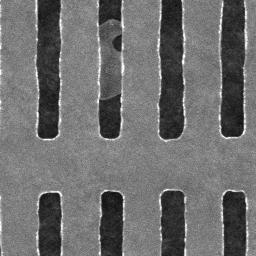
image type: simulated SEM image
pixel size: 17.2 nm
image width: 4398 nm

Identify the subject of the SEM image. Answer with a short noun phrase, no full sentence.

holes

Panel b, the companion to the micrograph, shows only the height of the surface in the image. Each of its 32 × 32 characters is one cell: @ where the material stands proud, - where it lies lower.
@@@@@---@@@@---@@@@@---@@@@@---@
@@@@@---@@@@---@@@@@---@@@@@---@
@@@@@--@@@@@---@@@@@---@@@@@---@
@@@@@--@@@@@---@@@@@---@@@@@---@
@@@@@---@@@@---@@@@@---@@@@@---@
@@@@@---@@@@---@@@@@---@@@@----@
@@@@@---@@@@---@@@@@---@@@@----@
@@@@---@@@@@@--@@@@@---@@@@@---@
@@@@@--@@@@@---@@@@@---@@@@@--@@
@@@@@--@@@@@---@@@@@---@@@@@--@@
@@@@@---@@@@---@@@@@---@@@@@---@
@@@@@---@@@@---@@@@@---@@@@@--@@
@@@@@--@@@@@---@@@@@---@@@@@--@@
@@@@@--@@@@@---@@@@@---@@@@@--@@
@@@@@--@@@@@---@@@@@---@@@@----@
@@@@@--@@@@@---@@@@@---@@@@@--@@
@@@@@--@@@@@@--@@@@@---@@@@@--@@
@@@@@@@@@@@@@@@@@@@@@@@@@@@@@@@@
@@@@@@@@@@@@@@@@@@@@@@@@@@@@@@@@
@@@@@@@@@@@@@@@@@@@@@@@@@@@@@@@@
@@@@@@@@@@@@@@@@@@@@@@@@@@@@@@@@
@@@@@@@@@@@@@@@@@@@@@@@@@@@@@@@@
@@@@@@@@@@@@@@@@@@@@@@@@@@@@@@@@
@@@@@@@@@@@@@@@@@@@@@@@@@@@@@@@@
@@@@@--@@@@@@--@@@@@---@@@@@---@
@@@@@---@@@@@--@@@@@---@@@@@---@
@@@@@---@@@@@--@@@@@---@@@@@---@
@@@@@---@@@@@--@@@@@---@@@@@---@
@@@@@---@@@@---@@@@@---@@@@@---@
@@@@@---@@@@---@@@@@---@@@@@---@
@@@@@---@@@@---@@@@@---@@@@@---@
@@@@@---@@@@---@@@@@---@@@@@---@